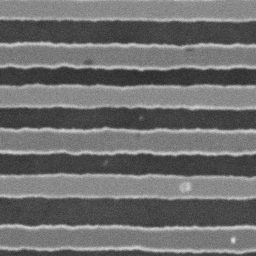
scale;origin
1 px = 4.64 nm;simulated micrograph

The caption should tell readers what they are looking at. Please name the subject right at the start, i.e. lines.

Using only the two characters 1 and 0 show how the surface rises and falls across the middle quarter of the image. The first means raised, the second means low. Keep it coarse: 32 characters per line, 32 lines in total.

11111111111111111111111111111111
00000000000000000001000000000000
00000000000000000000000000000000
00000000000000000000000000000000
00000000000000000000000000000000
11110000100000000000010000000000
11111111111111111111111111111111
11111111111111111111111111111111
11111111111111111111111111111111
11111111111111111111111111111111
11111111111111111111111111111111
00000000000000000000000000000000
00000000000000000000000000000000
00000000000000000000000000000000
00000000000000000000000000000000
00000000000000000000000000000000
00100001111111100000000111000100
11111111111111111111111111111111
11111111111111111111111111111111
11111111111111111111111111111111
11111111111111111111111111111111
11111111111111111111111111111111
00110000110110000100001111111101
00000000000000000000000000000000
00000000000000000000000000000000
00000000000000000000000000000000
00000000000000000000000000000000
00000100000000000000000000000000
11111111111111111111111111111111
11111111111111111111111111111111
11111111111111111111111111111111
11111111111111111111111111111111